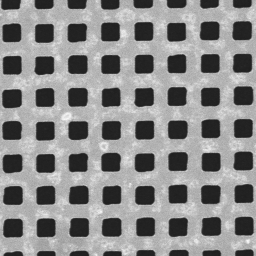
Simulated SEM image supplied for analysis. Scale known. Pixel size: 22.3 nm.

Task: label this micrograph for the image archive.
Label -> a regular array of holes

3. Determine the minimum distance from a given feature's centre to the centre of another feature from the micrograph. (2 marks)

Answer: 0.72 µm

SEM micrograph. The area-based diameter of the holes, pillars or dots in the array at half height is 0.472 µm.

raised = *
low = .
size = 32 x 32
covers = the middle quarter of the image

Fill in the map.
*.....***.....****.....***.....*
*.....***.....****....****.....*
**...*****...*****....**********
********************************
********************************
********************************
*.....***.....****....****.....*
*.....***.....****.....***.....*
*.....***.....****.....***.....*
*.....***.....****.....***.....*
*....*****....****....****....**
********************************
********************************
********************************
*.....****....****....****.....*
*.....***.....****.....***.....*
*.....***.....****.....***.....*
*.....***.....****.....***.....*
*.....****....****....****....**
********************************
********************************
********************************
**....****....****....****.....*
*.....***.....****.....***.....*
*.....***.....****.....***.....*
*.....***.....****.....***.....*
*.....***.....****....****.....*
********************************
********************************
********************************
**....****....*****...*****....*
*.....****....****.....***.....*